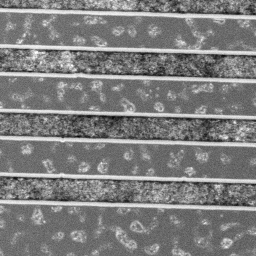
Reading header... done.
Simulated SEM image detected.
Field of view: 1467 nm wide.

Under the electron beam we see parallel lines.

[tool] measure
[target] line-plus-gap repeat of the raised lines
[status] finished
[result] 0.366 um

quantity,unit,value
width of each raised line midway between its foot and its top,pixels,37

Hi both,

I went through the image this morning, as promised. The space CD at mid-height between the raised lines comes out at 154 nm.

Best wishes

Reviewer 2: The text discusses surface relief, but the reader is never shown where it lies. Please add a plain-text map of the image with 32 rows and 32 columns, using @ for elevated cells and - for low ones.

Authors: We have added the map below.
--------------------------------
@@@@@@@@@-----------------------
@@@@@@@@@@@@@@@@@@@@@@@@@@@@@@@@
@@@@@@@@@@@@@@@@@@@@@@@@@@@@@@@@
@@@@@@@@@@@@@@@@@@@@@@@@@@@@@@@@
@@@@@@@@@@@@@@@@@@@@@@@@@@@@@@@@
-------------------------@@@@@@@
--------------------------------
--------------------------------
@@@@@@@@@@@@--------------------
@@@@@@@@@@@@@@@@@@@@@@@@@@@@@@@@
@@@@@@@@@@@@@@@@@@@@@@@@@@@@@@@@
@@@@@@@@@@@@@@@@@@@@@@@@@@@@@@@@
@@@@@@@@@@@@@@@@@@@@@@@@@@@@@@@@
------------------------@@@@@@@@
--------------------------------
--------------------------------
@@@@@@@@@-----------------------
@@@@@@@@@@@@@@@@@@@@@@@@@@@@@@@@
@@@@@@@@@@@@@@@@@@@@@@@@@@@@@@@@
@@@@@@@@@@@@@@@@@@@@@@@@@@@@@@@@
@@@@@@@@@@@@@@@@@@@@@@@@@@@@@@@@
--------------------------@@@@@@
--------------------------------
--------------------------------
@@@@@@@@@@----------------------
@@@@@@@@@@@@@@@@@@@@@@@@@@@@@@@@
@@@@@@@@@@@@@@@@@@@@@@@@@@@@@@@@
@@@@@@@@@@@@@@@@@@@@@@@@@@@@@@@@
@@@@@@@@@@@@@@@@@@@@@@@@@@@@@@@@
@@@@@@@@@@@@@@@@@@@@@@@@@@@@@@@@
@@@@@@@@@@@@@@@@@@@@@@@@@@@@@@@@